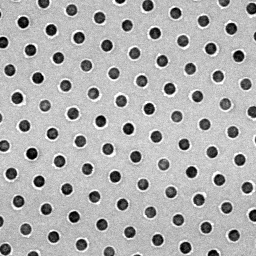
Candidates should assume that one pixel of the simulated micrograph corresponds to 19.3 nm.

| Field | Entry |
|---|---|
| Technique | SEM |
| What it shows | a regular array of holes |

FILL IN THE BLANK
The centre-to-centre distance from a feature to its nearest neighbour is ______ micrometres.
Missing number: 0.552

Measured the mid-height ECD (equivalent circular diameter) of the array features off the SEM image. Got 241 nm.